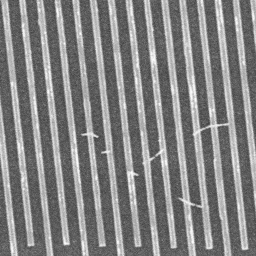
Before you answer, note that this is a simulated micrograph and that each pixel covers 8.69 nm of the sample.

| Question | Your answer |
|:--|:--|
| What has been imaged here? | parallel lines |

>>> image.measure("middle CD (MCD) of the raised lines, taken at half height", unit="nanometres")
46.4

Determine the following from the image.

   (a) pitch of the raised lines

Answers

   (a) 154 nanometers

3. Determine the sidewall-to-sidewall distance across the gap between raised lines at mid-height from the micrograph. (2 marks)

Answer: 109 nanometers